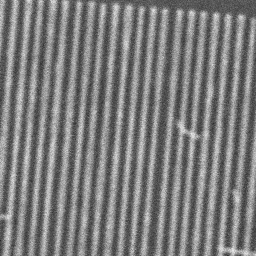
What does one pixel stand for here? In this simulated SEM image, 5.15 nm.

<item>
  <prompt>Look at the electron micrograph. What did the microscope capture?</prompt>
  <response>parallel lines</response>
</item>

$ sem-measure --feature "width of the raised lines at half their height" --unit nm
23.7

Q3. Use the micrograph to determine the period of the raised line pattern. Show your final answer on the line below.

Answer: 64.7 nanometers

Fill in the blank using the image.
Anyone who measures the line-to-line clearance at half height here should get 42.9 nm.